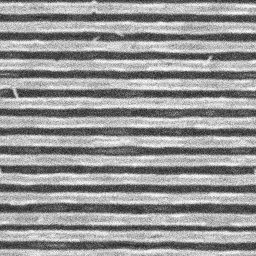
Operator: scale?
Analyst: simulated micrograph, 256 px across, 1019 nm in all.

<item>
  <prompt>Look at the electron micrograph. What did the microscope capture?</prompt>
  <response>parallel lines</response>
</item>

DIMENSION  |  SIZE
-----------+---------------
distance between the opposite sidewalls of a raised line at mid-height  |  42.3 nanometres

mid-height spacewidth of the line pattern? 34.9 nanometres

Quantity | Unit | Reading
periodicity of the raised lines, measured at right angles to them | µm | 0.0756